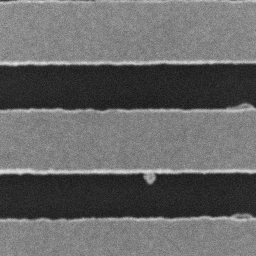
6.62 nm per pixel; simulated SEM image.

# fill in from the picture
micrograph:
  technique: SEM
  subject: lines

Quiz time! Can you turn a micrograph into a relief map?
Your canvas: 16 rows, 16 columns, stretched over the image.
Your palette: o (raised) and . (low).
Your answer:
oooooooooooooooo
oooooooooooooooo
oooooooooooooooo
oooooooooooooooo
................
................
................
oooooooooooooooo
oooooooooooooooo
oooooooooooooooo
oooooooooooooooo
................
................
................
oooooooooooooooo
oooooooooooooooo